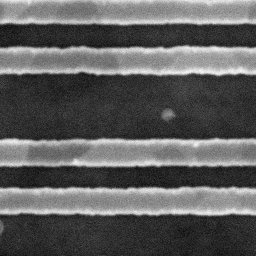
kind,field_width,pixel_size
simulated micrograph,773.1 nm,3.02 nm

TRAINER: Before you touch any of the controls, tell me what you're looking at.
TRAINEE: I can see lines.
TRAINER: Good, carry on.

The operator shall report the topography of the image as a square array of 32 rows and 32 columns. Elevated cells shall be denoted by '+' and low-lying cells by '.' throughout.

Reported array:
++++++++++++++++++++++++++++++++
++++++++++++++++++++++++++++++++
++++++++++++++++++++++++++++++++
................................
................................
................................
++++++++++++++++++++++++++++++++
++++++++++++++++++++++++++++++++
++++++++++++++++++++++++++++++++
................................
................................
................................
................................
................................
................................
................................
................................
...............................+
++++++++++++++++++++++++++++++++
++++++++++++++++++++++++++++++++
++++++++++++++++++++++++++++++++
................................
................................
................................
++++++++++++++++++++++++++++++++
++++++++++++++++++++++++++++++++
++..++++++++++++++++++++++++++++
................................
................................
................................
................................
................................